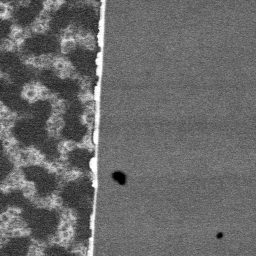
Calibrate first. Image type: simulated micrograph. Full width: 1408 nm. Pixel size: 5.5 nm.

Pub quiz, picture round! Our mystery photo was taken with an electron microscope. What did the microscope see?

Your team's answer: one or a few lines or trenches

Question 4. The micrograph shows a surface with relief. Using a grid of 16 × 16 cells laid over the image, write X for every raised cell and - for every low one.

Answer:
XXXXXX----------
XXXXXX----------
XXXXXX----------
XXXXXX----------
XXXXXX----------
XXXXXX----------
XXXXXX----------
XXXXXX----------
XXXXXX----------
XXXXXX----------
XXXXXX----------
XXXXXX----------
XXXXXX----------
XXXXXX----------
XXXXXX----------
XXXXXX----------